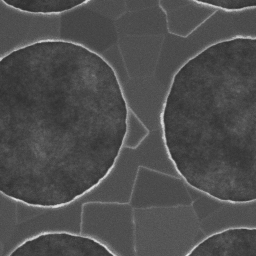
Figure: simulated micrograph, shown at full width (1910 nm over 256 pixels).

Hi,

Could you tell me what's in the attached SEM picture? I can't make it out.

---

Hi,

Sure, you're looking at holes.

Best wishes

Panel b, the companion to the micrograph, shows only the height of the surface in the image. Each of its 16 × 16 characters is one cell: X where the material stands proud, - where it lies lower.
X---XXXXXXXXXX-X
XXXXXXXXXXXXXXXX
XXXXXXXXXXXXXX--
------XXXXXX----
-------XXXX-----
-------XXXX-----
--------XX------
--------XX------
--------XX------
-------XXXX-----
-------XXXX-----
------XXXXXX----
X---XXXXXXXXXX--
XXXXXXXXXXXXXXXX
XXXXXXXXXXXXXX--
X------XXXXX----